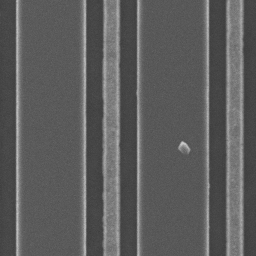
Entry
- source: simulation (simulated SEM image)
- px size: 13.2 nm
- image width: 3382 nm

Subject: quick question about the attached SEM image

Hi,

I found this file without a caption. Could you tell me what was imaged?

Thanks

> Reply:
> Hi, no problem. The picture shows lines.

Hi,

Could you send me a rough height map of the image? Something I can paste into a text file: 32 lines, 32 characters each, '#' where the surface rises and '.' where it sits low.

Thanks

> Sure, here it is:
..#########..##..#########..##..
..#########..##..#########..##..
..#########..##..#########..##..
..#########..##..#########..##..
..#########..##..#########..##..
..#########..##..#########..##..
..#########..##..#########..##..
..#########..##..#########..##..
..#########..##..#########..##..
..#########..##..#########..##..
..#########..##..#########..##..
..#########..##..#########..##..
..#########..##..#########..##..
..#########..##..#########..##..
..#########..##..#########..##..
..#########..##..#########..##..
..#########..##..#########..##..
..#########..##..#########..##..
..#########..##..#########..##..
..#########..##..#########...#..
..#########..##..#########..##..
..#########..##..#########..##..
..#########..##..#########..##..
..#########..##..#########..##..
..#########..##..#########..##..
..#########..##..#########..##..
..#########..##..#########..##..
..#########..##..#########..##..
..#########..##..#########...#..
..#########..##..#########...#..
..#########..##..#########..##..
..#########..##..#########..##..